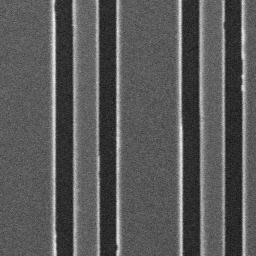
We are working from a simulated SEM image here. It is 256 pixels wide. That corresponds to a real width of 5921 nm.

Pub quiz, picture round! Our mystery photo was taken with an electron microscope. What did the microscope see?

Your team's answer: lines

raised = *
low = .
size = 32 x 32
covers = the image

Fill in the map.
*******..***...********..***..**
*******..***...********..***..**
*******..***...********..***..**
*******..***...********..***..**
*******..***...********..***..**
*******..***...********..***..**
*******..***...********..***..**
*******..***...********..***..**
*******..***...********..***..**
*******..***...********..***..**
*******..***...********..***..**
*******..***...********..***..**
*******..***...********..***..**
*******..***...********..***..**
*******..***...********..***..**
*******..***...********..***..**
*******..***...********..***..**
*******..***...********..***..**
*******..***...********..***..**
*******..***...********..***..**
*******..***...********..***..**
*******..***...********..***..**
*******..***...********..***..**
*******..***...********..***..**
*******..***...********..***..**
*******..***...********..***..**
*******..***...********..***..**
*******..***...********..***..**
*******..***...********..***..**
*******..***...********..***..**
*******..***...********..***..**
*******..***...********..***..**